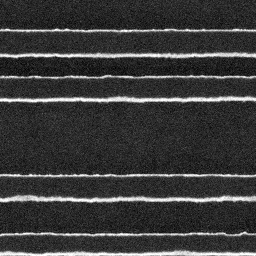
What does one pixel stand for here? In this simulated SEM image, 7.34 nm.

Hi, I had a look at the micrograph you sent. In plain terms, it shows lines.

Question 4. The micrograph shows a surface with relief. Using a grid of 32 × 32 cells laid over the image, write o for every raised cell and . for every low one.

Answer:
................................
................................
................................
................................
oooooooooooooooooooooooooooooooo
oooooooooooooooooooooooooooooooo
oooooooooooooooooooooooooooooooo
................................
................................
.............o........oo.o......
oooooooooooooooooooooooooooooooo
oooooooooooooooooooooooooooooooo
oooooooooooooo..ooooooooooo.....
................................
................................
................................
................................
................................
................................
................................
................................
................................
oooooooooooooooooooooooooooooooo
oooooooooooooooooooooooooooooooo
oooooooooooooooooooooooooooooooo
................................
................................
................................
................................
oooooooooooooooooooooooooooooooo
oooooooooooooooooooooooooooooooo
oooooooooooooooooooooooooooooooo